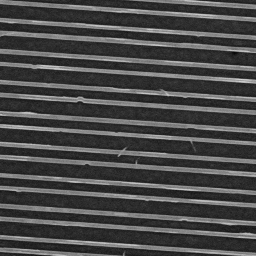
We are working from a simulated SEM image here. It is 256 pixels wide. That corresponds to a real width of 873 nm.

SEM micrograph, parallel lines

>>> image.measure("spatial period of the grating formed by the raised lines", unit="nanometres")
52.9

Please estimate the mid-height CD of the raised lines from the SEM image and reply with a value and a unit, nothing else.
15.7 nanometers